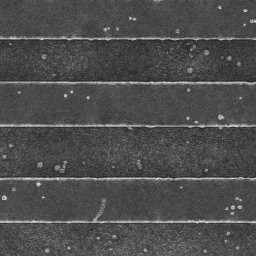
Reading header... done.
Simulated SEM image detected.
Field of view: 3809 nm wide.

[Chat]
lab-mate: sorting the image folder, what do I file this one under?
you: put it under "lines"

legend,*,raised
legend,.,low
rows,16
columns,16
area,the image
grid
****************
****************
................
................
................
****************
****************
****************
................
................
................
****************
****************
****************
................
................